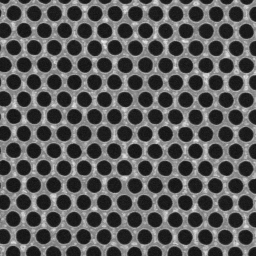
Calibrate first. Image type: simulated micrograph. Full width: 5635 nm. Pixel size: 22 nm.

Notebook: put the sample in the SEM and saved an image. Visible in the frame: a regular array of holes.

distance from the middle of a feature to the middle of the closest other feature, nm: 431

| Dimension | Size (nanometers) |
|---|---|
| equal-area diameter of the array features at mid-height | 342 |